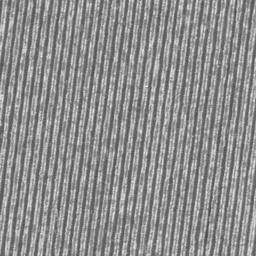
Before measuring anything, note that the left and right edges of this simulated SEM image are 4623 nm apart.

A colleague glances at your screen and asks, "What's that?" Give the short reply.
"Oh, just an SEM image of parallel lines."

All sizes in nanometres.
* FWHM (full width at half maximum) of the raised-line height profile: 67.2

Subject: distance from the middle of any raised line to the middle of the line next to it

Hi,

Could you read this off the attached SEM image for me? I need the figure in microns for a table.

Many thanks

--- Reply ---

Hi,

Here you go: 0.15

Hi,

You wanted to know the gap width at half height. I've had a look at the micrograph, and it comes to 0.0828 microns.